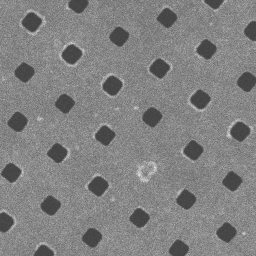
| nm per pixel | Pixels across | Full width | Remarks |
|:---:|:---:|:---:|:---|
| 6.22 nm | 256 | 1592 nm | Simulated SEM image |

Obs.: a regular array of holes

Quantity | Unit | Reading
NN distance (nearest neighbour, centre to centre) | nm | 311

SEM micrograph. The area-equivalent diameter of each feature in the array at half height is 117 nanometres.